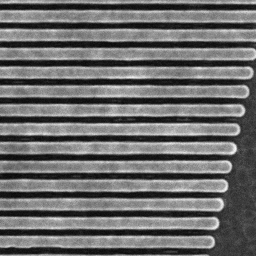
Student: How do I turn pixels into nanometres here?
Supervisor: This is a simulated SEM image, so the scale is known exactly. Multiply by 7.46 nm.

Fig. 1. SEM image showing parallel lines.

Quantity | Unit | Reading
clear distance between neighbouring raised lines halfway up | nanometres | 54.1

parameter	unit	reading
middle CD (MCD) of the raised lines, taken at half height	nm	88.6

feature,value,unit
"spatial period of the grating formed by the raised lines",140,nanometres